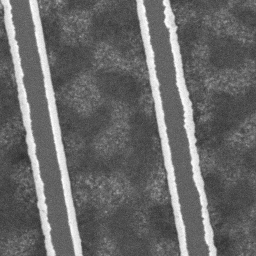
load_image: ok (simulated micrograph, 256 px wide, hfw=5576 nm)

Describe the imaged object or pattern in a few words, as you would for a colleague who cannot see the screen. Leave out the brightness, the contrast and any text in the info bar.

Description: one or a few lines or trenches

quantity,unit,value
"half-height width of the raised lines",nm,587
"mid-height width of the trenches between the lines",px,104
